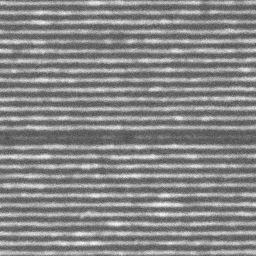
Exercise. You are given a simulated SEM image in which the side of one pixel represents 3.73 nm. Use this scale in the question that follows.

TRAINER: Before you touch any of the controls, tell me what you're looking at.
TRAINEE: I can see parallel lines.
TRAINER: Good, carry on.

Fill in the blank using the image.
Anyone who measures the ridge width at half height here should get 8.9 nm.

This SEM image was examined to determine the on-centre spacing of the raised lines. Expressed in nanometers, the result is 35.9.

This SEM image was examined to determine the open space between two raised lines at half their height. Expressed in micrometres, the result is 0.0266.